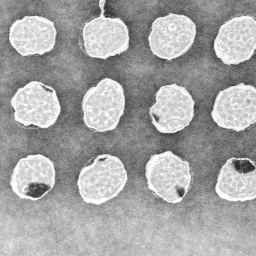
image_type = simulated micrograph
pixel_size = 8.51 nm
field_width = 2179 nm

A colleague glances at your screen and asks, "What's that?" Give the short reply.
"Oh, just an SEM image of a regular array of raised bodies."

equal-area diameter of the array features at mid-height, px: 45.1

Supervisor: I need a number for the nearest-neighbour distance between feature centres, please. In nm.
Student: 574